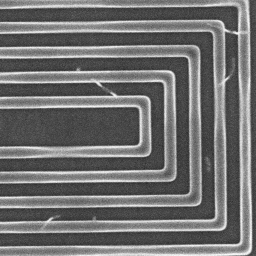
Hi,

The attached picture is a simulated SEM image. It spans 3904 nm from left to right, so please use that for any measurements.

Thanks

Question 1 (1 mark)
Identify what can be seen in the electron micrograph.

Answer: groups of lines, slits or small figures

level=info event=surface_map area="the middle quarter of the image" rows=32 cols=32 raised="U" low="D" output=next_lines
DDDDDDDDDDDDDDDDDDDDDDDDDDDDDDDU
DDDDDDDDDDDDDDDDDDDDDDDDDDDDDDDD
UUUUUUUUUUUUUUUUUUUUUUUUUUUDDDDD
UUUUUUUUUUUUUUUUUUUUUUUUUUUUDDDD
DDDDDDDDUDDDDDDDDDDDDDDDDUUUDDDD
DDDDDDDDDDDDDDDDDDDDDDDDDUUUDDDD
DDDDDDDDDDDDDDDDDDDDDDDDDUUUDDDD
DDDDDDDDDDDDDDDDDDDDDDDDDUUUDDDD
UUUUUUUUUUUUUUUUUUUUUDDDDUUUDDDD
UUUUUUUUUUUUUUUUUUUUUDDDDUUUDDDD
UUUUUUUUUUUUUUUUDUUUUDDDDUUUDDDD
DDDDDDDDDDDDDDDDDDDUUDDDDUUUDDDD
DDDDDDDDDDDDDDDDDDDUUDDDDUUUDDDD
DDDDDDDDDDDDDDDDDDDUUDDDDUUUDDDD
DDDDDDDDDDDDDDDDDDDUUDDDDUUUDDDD
DDDDDDDDDDDDDDDDDDDUUDDDDUUUDDDD
DDDDDDDDDDDDDDDDDDDUUDDDDUUUDDDD
DDDDDDDDDDDDDDDDDDDUUUDDDUUUDDDD
DDDDDDDDDDDDDDDDDDDUUUDDDUUUDDDD
DDDDDDDDDDDDDDDDDDDUUUDDDUUUDDDD
DDDDDDDDDDDDDDDDDDUUUUDDDUUUDDDD
UUUUUUUUUUUUUUUUUUUUUUDDDUUUDDDD
UUUUUUUUUUUUUUUUUUUUUDDDDUUUDDDD
DDDDDDDDDDDDDDDDDDDDDDDDDUUUDDDD
DDDDDDDDDDDDDDDDDDDDDDDDDUUUDDDD
DDDDDDDDDDDDDDDDDDDDDDDDDUUUDDDD
DDDDDDDDDDDDDDDDDDDDDDDDUUUUDDDD
UUUUUUUUUUUUUUUUUUUUUUUUUUUUDDDD
UUUUUUUUUUUUUUUUUUUUUUUUUUUUDDDD
DDDDDDDDDDDDDDDDDDDDDDDDDDDDDDDD
DDDDDDDDDDDDDDDDDDDDDDDDDDDDDDDD
DDDDDDDDDDDDDDDDDDDDDDDDDDDDDDDD